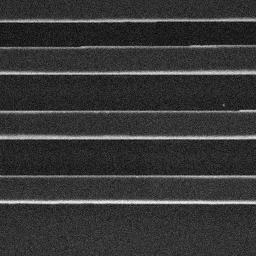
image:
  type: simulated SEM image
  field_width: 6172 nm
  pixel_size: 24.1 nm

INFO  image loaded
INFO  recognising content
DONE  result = lines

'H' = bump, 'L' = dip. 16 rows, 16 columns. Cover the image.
HHHHHHHHHHHHHHHH
LLLLLLLLLLLLLLLL
LLLLLLLLLLLLLLLL
HHHHHHHHHHHHHHHH
HHHHHHHHHHHHHHHH
LLLLLLLLLLLLLLLL
LLLLLLLLLLLLLLLL
HHHHHHHHHHHHHHHH
HHHHHHHHHHHHHHHH
LLLLLLLLLLLLLLLL
LLLLLLLLLLLLLLLL
HHHHHHHHHHHHHHHH
HHHHHHHHHHHHHHHH
LLLLLLLLLLLLLLLL
LLLLLLLLLLLLLLLL
LLLLLLLLLLLLLLLL